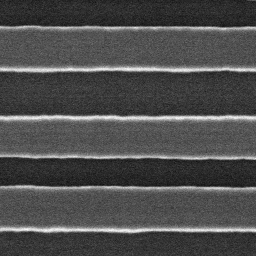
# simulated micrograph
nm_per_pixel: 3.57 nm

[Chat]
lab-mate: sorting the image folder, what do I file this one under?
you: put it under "lines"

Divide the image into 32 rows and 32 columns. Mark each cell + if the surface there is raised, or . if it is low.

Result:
................................
................................
................................
+++++++++++++++++++++++++++...++
++++++++++++++++++++++++++++++++
++++++++++++++++++++++++++++++++
++++++++++++++++++++++++++++++++
++++++++++++++++++++++++++++++++
++++++++++++++++++++++++++++++++
................................
................................
................................
................................
................................
................................
++++++++++++++++++++++++++++++++
++++++++++++++++++++++++++++++++
++++++++++++++++++++++++++++++++
++++++++++++++++++++++++++++++++
++++++++++++++++++++++++++++++++
................................
................................
................................
+++++++++++++++++++++++++++++...
++++++++++++++++++++++++++++++++
++++++++++++++++++++++++++++++++
++++++++++++++++++++++++++++++++
++++++++++++++++++++++++++++++++
++++++++++++++++++++++++++++++++
................................
................................
................................